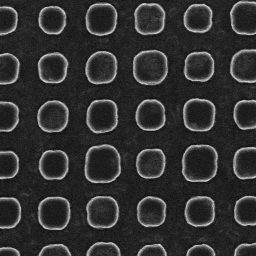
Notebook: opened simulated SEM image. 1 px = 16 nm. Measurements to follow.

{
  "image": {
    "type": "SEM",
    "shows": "a regular array of raised bodies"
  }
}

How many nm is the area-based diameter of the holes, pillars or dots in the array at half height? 497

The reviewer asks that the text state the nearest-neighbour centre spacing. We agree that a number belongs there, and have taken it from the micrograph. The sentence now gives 773 nm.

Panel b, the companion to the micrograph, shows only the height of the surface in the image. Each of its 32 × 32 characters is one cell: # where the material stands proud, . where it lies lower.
..............................##
##...###...####..###...###...###
##...###...####..###...###...###
##...###...###...###...###...###
................................
................................
..................##..........##
##...###...###...####..####..###
##...###...###...####..####..###
##...###...###...####..###...###
................................
................................
........................#.......
##...###...####..###...####..###
##...###...####..###...####..###
##...###...###...###...####...##
............#...................
................................
............##..........##......
##...###...####..###...####..###
##...###...####..####..####..###
##...###...####..###...####..###
...........###..........##......
................................
................................
##...####..####..###...####...##
###..####..####..####..####..###
##...####..####..###...####...##
......##........................
................................
............##..................
##...####..####..####...###..###